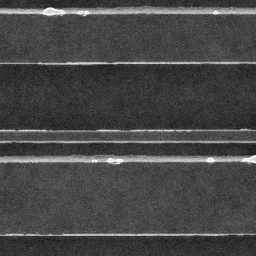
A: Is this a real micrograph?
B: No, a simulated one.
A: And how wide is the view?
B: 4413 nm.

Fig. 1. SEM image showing lines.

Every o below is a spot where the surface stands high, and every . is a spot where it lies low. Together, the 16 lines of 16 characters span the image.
oooooooooooooooo
oooooooooooooooo
oooooooooooooooo
oooooooooooooooo
................
................
................
................
oooooooooooooooo
oooooooooooooooo
oooooooooooooooo
oooooooooooooooo
oooooooooooooooo
oooooooooooooooo
oooooooooooooooo
................